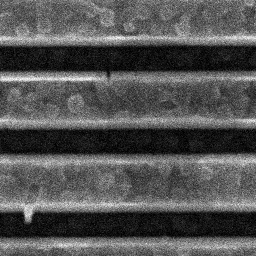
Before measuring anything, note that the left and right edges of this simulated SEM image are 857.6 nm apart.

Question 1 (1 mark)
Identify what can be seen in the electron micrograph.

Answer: one or a few lines or trenches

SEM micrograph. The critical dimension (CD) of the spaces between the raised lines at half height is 0.113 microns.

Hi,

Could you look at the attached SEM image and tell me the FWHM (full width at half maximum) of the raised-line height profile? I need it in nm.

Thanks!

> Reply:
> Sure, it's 166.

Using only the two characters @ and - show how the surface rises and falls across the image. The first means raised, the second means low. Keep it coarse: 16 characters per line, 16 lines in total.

@@@@@@@@@@@@@@@@
@@@@@@@@@@@@@@@@
@@@@@@@@@@@@@@@@
----------------
----------------
@@@@@@@@@@@@@@@@
@@@@@@@@@@@@@@@@
@@@@@@@@@@@@@@@@
----------------
----------------
@@@@@@@@@@@@@@@@
@@@@@@@@@@@@@@@@
@@@@@@@@@@@@@@@@
----------------
----------------
@@@@@@@@@@@@@@@@